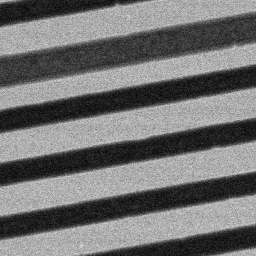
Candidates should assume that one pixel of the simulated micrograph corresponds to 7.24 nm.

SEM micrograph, parallel lines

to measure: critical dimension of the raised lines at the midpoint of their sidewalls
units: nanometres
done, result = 238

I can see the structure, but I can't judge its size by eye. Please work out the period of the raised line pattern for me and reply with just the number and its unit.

375 nanometers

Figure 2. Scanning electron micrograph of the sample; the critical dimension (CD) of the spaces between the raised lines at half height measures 0.143 microns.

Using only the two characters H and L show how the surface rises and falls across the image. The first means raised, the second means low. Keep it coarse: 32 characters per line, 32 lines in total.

HLLLLLLLLLLLLLHHHHHHHHHHHHHHHHHH
LLLLLLLLLHHHHHHHHHHHHHHHHHHHHHHH
LLLLHHHHHHHHHHHHHHHHHHHHHHHLLLLL
HHHHHHHHHHHHHHHHHHHHHLLLLLLLLLLL
HHHHHHHHHHHHHHHHLLLLLLLLLLLLLLLL
HHHHHHHHHHLLLLLLLLLLLLLLLLLLLLHH
HHHHHLLLLLLLLLLLLLLLLLLLLHHHHHHH
LLLLLLLLLLLLLLLLLLLHHHHHHHHHHHHH
LLLLLLLLLLLLLHHHHHHHHHHHHHHHHHHL
LLLLLLLLHHHHHHHHHHHHHHHHHLLLLLLL
LLHHHHHHHHHHHHHHHHHHLLLLLLLLLLLL
HHHHHHHHHHHHHHLLLLLLLLLLLLLLHHHH
HHHHHHHHLLLLLLLLLLLLLLLHHHHHHHHH
HHHLLLLLLLLLLLLLLHHHHHHHHHHHHHHH
LLLLLLLLLLLHHHHHHHHHHHHHHHHHHHHH
LLLLLHHHHHHHHHHHHHHHHHHHHHHHLLLL
HHHHHHHHHHHHHHHHHHHHHHHLLLLLLLLL
HHHHHHHHHHHHHHHHHHLLLLLLLLLLLLLH
HHHHHHHHHHHHLLLLLLLLLLLLLLHHHHHH
HHHHHHLLLLLLLLLLLLLLLHHHHHHHHHHH
LLLLLLLLLLLLLLLHHHHHHHHHHHHHHHHH
LLLLLLLLLHHHHHHHHHHHHHHHHHHHHHHH
LLLHHHHHHHHHHHHHHHHHHHHHHHHLLLLL
HHHHHHHHHHHHHHHHHHHHHLLLLLLLLLLL
HHHHHHHHHHHHHHHLLLLLLLLLLLLLLLHH
HHHHHHHHHHLLLLLLLLLLLLLLHHHHHHHH
HHHHLLLLLLLLLLLLLLHHHHHHHHHHHHHH
LLLLLLLLLLLLLHHHHHHHHHHHHHHHHHHH
LLLLLLLHHHHHHHHHHHHHHHHHHHHHHHHL
LLHHHHHHHHHHHHHHHHHHHHHHHLLLLLLL
HHHHHHHHHHHHHHHHHHHHLLLLLLLLLLLL
HHHHHHHHHHHHHHLLLLLLLLLLLLLLHHHH